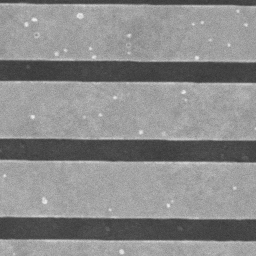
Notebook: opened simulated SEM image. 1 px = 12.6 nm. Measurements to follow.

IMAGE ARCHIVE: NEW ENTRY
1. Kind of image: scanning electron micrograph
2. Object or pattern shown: lines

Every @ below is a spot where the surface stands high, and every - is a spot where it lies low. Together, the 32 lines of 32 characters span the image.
@@@@----------------------------
@@@@@@@@@@@@@@@@@@@@@@@@@@@@@@@@
@@@@@@@@@@@@@@@@@@@@@@@@@@@@@@@@
@@@@@@@@@@@@@@@@@@@@@@@@@@@@@@@@
@@@@@@@@@@@@@@@@@@@@@@@@@@@@@@@@
@@@@@@@@@@@@@@@@@@@@@@@@@@@@@@@@
@@@@@@@@@@@@@@@@@@@@@@@@@@@@@@@@
--@@@@@@@@@@@@@@@@@@@@@@@@@@@@@@
--------------------------------
--------------------------------
@@@@@@@@@@@@@@@@@@@@@@@@@@@@@@@@
@@@@@@@@@@@@@@@@@@@@@@@@@@@@@@@@
@@@@@@@@@@@@@@@@@@@@@@@@@@@@@@@@
@@@@@@@@@@@@@@@@@@@@@@@@@@@@@@@@
@@@@@@@@@@@@@@@@@@@@@@@@@@@@@@@@
@@@@@@@@@@@@@@@@@@@@@@@@@@@@@@@@
@@@@@@@@@@@@@@@@@@@@@@@@@@@@@@@@
--------------------------------
--------------------------------
--------------------------------
@@@@@@@@@@@@@@@@@@@@@@@@@@@@@@@@
@@@@@@@@@@@@@@@@@@@@@@@@@@@@@@@@
@@@@@@@@@@@@@@@@@@@@@@@@@@@@@@@@
@@@@@@@@@@@@@@@@@@@@@@@@@@@@@@@@
@@@@@@@@@@@@@@@@@@@@@@@@@@@@@@@@
@@@@@@@@@@@@@@@@@@@@@@@@@@@@@@@@
@@@@@@@@@@@@@@@@@@@@@@@@@@@@@@@@
--------------------------------
--------------------------------
--------------------------------
@@@@@@@@@@@@@@@@@@@@@@@@@@@@@@@@
@@@@@@@@@@@@@@@@@@@@@@@@@@@@@@@@